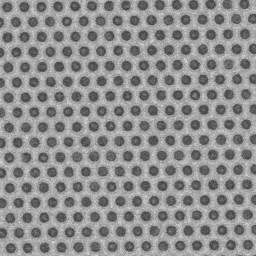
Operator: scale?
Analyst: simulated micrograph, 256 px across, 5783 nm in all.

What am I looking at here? a regular array of holes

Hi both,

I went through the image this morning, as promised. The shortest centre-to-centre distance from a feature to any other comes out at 381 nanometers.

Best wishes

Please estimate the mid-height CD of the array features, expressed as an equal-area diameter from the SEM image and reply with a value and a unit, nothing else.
240 nm